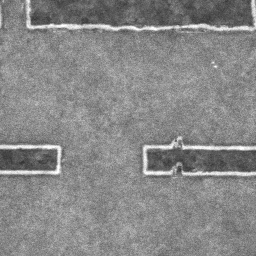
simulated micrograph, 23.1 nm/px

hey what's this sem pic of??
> one or a few lines or trenches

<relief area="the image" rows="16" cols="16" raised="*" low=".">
..**************
..**************
................
................
................
................
................
................
................
****.....*******
***......*******
................
................
................
................
................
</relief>